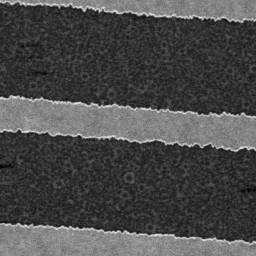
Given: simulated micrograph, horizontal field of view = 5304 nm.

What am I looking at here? one or a few lines or trenches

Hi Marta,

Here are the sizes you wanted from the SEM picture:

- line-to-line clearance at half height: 1930 nm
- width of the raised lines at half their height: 679 nanometers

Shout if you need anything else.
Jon